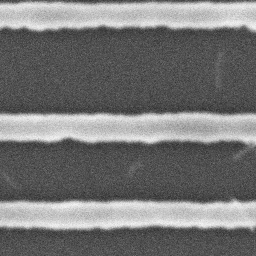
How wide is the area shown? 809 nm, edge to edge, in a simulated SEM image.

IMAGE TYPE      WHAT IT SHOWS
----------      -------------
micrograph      lines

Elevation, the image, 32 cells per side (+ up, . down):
++++++++++..++++++++++++++++++++
++++++++++++++++++++++++++++++++
++++++++++++++++++++++++++++++++
....++++.......................+
................................
................................
................................
................................
................................
................................
................................
................................
................................
................................
+++++.+++++++++..+++++++++++.+++
++++++++++++++++++++++++++++++++
++++++++++++++++++++++++++++++++
..+..++...++++++++++..+.+++.+.++
................................
................................
................................
................................
................................
................................
................................
+++++++++++++++++++++++++.++++++
++++++++++++++++++++++++++++++++
++++++++++++++++++++++++++++++++
......+++++..+..................
................................
................................
................................